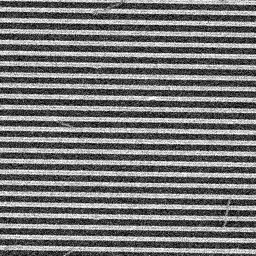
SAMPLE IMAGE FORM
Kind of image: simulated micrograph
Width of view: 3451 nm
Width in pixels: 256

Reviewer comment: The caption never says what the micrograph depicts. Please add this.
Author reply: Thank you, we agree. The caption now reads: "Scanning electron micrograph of parallel lines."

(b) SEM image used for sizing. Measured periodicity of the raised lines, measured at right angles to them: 10.8 pixels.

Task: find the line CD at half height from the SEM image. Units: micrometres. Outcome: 0.0489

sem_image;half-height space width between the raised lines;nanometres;97.7